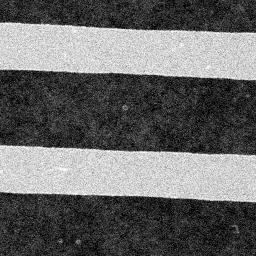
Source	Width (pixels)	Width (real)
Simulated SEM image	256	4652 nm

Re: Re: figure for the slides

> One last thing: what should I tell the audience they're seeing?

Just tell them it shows one or a few lines or trenches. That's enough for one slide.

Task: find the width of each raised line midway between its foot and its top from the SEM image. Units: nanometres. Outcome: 826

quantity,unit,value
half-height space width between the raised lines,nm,1400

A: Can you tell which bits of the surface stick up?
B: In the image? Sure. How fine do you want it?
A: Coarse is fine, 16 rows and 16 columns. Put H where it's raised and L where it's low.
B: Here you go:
LLLLLLLLLLLLLLLL
HLLLLLLLLLLLLLLL
HHHHHHHHHHHHHHHH
HHHHHHHHHHHHHHHH
LLLLLHHHHHHHHHHH
LLLLLLLLLLLLLLLL
LLLLLLLLLLLLLLLL
LLLLLLLLLLLLLLLL
LLLLLLLLLLLLLLLL
HHHHHHHHLLLLLLLL
HHHHHHHHHHHHHHHH
HHHHHHHHHHHHHHHH
LLLLLLLLLLLLLLHH
LLLLLLLLLLLLLLLL
LLLLLLLLLLLLLLLL
LLLLLLLLLLLLLLLL